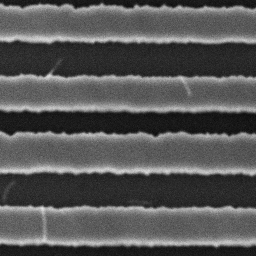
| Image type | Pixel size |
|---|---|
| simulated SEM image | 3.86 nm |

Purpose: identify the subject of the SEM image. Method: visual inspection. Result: lines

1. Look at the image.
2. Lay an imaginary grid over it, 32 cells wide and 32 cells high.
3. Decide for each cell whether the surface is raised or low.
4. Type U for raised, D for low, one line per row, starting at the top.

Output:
DDDDDDDDDDDDDDDDDDDDDDDDDDDDDDDD
UUUUUUUUUUUUUUUUUUUUUUUUUUUUUUUU
UUUUUUUUUUUUUUUUUUUUUUUUUUUUUUUU
UUUUUUUUUUUUUUUUUUUUUUUUUUUUUUUU
UUUUUUUUUUUUUUUUUUUUUUUUUUUUUUUU
DDDDDDDDDDDDDDDDDDDDDDDDDDDDDDDD
DDDDDDDDDDDDDDDDDDDDDDDDDDDDDDDD
DDDDDDDDDDDDDDDDDDDDDDDDDDDDDDDD
DDDDDDDDDDDDDDDDDDDDDDDDDDDDDDDD
DDUUDDUDDDDDDDDDDDDDDDDDDDDDDDDD
UUUUUUUUUUUUUUUUUUUUUUUUUUUUUUUU
UUUUUUUUUUUUUUUUUUUUUUUUUUUUUUUU
UUUUUUUUUUUUUUUUUUUUUUUUUUUUUUUU
UUUUUUUUUUUUUUUUUUUUUUUUUUUUUUUU
DDDDDDDDDDDDDDDDDDDDDDDDDDDDDDDD
DDDDDDDDDDDDDDDDDDDDDDDDDDDDDDDD
DDDDDDDDDDDDDDDDDDDDDDDDDDDDDDDD
UUUUUUUUUUUUUUUUUUUUUUUUUUUUUUUU
UUUUUUUUUUUUUUUUUUUUUUUUUUUUUUUU
UUUUUUUUUUUUUUUUUUUUUUUUUUUUUUUU
UUUUUUUUUUUUUUUUUUUUUUUUUUUUUUUU
UUUUUDDUUUUUUDUUUUUUUUUUUUUUUUUU
DDDDDDDDDDDDDDDDDDDDDDDDDDDDDDDD
DDDDDDDDDDDDDDDDDDDDDDDDDDDDDDDD
DDDDDDDDDDDDDDDDDDDDDDDDDDDDDDDD
DDDDDDDDDDDDDDDDDDDDDDDDDDDDDDDD
UUUUUUUUUUUUUUUUUUUUUUUUUUUUUUUU
UUUUUUUUUUUUUUUUUUUUUUUUUUUUUUUU
UUUUUUUUUUUUUUUUUUUUUUUUUUUUUUUU
UUUUUUUUUUUUUUUUUUUUUUUUUUUUUUUU
DUUUUDUUUUUUUUUUUUUUUUUUUUUUUUUU
DDDDDDDDDDDDDDDDDDDDDDDDDDDDDDDD